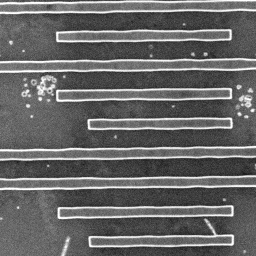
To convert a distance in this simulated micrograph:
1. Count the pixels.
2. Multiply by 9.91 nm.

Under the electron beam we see groups of lines, slits or small figures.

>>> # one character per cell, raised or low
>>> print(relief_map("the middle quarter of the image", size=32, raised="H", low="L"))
HHHHHHHHHHHHHHHHHHHHHHHHHHHHHHHH
HHHHHHHHHHHHHHHHHHHHHHHLLLLLLLLL
LLLLLLLLLLLLLLLLLLLLLLLLLLLLLLLL
LLLLLLLLLLLLLLLLLLLLLLLLLLLLLLLL
LLLLLLLLLLLLLLLLLLLLLLLLLLLLLLLL
LLLLLLLLLLLLLLLLLLLLLLLLLLLLLLLL
LLLLLLLLLLLLLLLHHHLLHHHHHHHHHHHH
HHHHHHHHHHHHHHHHHHHHHHHHHHHHHHHH
HHHHHHHHHHHHHHHHHHHHHHHHHHHHHHHH
LLLLLLLLLLLLLLLLLLLLLLLLLLLLLLLL
LLLLLLLLLLLLLLLLLLLLLLLLLLLLLLLL
LLLLLLLLLLLLLLLLLLLLLLLLLLLLLLLL
LLLLLLLLLLLLLLLLLLLLLLLLLLLLLLLL
LLLLLLLLLLLLLLLLLLLLLLLLLLLLLLLL
LLLLLLHHHHHHHHHHHHHHHHHHHHHHHHHH
LLLLLLHHHHHHHHHHHHHHHHHHHHHHHHHH
LLLLLLLLLLLLLLLLLLLLLLLLLLLLLLLL
LLLLLLLLLLLLLLLLLLLLLLLLLLLLLLLL
LLLLLLLLLLLLLLLLLLLLLLLLLLLLLLLL
LLLLLLLLLLLLLLLLLLLLLLLLLLLLLLLL
LLLLLLLLLLLLLLLLLLLLLLLLLLLLLLLL
HHHHHHHHHHHHHHHHHHHHHHHHHHHHHHHH
HHHHHHHHHHHHHHHHHHHHHHHHHHHHHHHH
HHHHHHHHHHHHHHHHLLLLLLLLLLLLLLLL
LLLLLLLLLLLLLLLLLLLLLLLLLLLLLLLL
LLLLLLLLLLLLLLLLLLLLLLLLLLLLLLLL
LLLLLLLLLLLLLLLLLLLLLLLLLLLLLLLL
LLLLLLLLLLLLLLLLLLLLLLLLLLLLLLLL
LLLLLLLLLLLLLLLLLLLLLLLLLHLLLLLL
HHHHHHHHHHHHHHHHHHHHHHHHHHHHHHHH
HHHHHHHHHHHHHHHHHHHHHHHHHHHHHHHH
LLLLLLLLLLLLLLLLLLLLLLLLLLLLLLLL